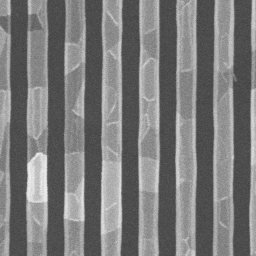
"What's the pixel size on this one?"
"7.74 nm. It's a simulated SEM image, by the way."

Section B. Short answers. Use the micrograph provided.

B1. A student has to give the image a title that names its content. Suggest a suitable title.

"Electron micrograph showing wiring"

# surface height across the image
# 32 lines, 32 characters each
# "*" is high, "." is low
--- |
*...**..**...**...**..**...**...
*...**..**...**...**..**...**...
*...**..**...**...**..**...**...
*...**..**...**...**..**...**...
*...**..**...**...**..**...**...
*...**..**...**...**..**...**...
*...**..**...**...**..**...**...
*...**..**...**...**..**...**...
*...**..**...**...**..**...**...
*...**..**...**...**..**...**...
*...**..**...**...**..**...**...
*...**..**...**...**..**...**...
*...**..**...**...**..**...**...
*...**..**...**...**..**...**...
*...**..**...**...**..**...**...
*...**..**...**...**..**...**...
*...**..**...**...**..**...**...
*...**..**...**..***..**...**...
*...**..**...**..***..**...**...
*...**..**...**..***..**...**...
*...**..**...**...**..**...**...
*...**..**...**...**..**...**...
*...**..**...**...**..**...**...
*...**..**...**...*...**...**...
*...**..**...**...*...**...**...
*...**..**...**...*...**...**..*
*...**..**...**...*...**...**..*
*...**..**...**...*...**...**..*
*...**..**...**...*...**...**...
*...*...**...**...*...**...**...
*...*...**...**...*...**...**...
*...*...**...**...*...**...**...